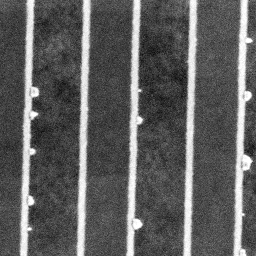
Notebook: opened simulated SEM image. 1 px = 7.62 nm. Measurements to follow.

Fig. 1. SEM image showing lines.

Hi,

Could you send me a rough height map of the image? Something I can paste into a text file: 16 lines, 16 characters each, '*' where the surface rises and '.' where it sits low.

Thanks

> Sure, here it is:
**...****...***.
**...****...***.
**...***....***.
**...***....***.
**...***....***.
**...***....***.
**...***....***.
**...***....***.
**...***....***.
**...***....***.
**...***....***.
**...***....***.
**...***....***.
**...***....***.
**...***....***.
**...***....***.